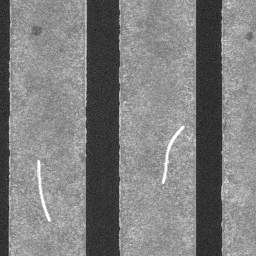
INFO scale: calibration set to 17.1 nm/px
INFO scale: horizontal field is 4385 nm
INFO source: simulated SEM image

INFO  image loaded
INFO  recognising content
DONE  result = lines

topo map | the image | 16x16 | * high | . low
.****..*****..**
.****..*****..**
.****..*****..**
.****..*****..**
.****..*****..**
.****..*****..**
.****..*****..**
.****..*****..**
.****..*****..**
.****..*****..**
.****..*****..**
.****..*****..**
.****..*****..**
.****..*****..**
.****..*****..**
.****..*****..**